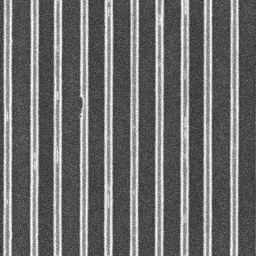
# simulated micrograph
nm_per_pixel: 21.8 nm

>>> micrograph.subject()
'parallel lines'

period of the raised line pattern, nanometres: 550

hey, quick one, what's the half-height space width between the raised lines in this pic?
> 412 nm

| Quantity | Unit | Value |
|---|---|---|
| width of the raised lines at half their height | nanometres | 144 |